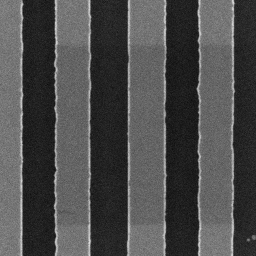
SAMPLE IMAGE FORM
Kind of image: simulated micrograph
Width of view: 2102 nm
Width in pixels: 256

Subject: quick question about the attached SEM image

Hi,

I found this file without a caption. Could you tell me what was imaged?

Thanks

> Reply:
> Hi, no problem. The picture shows lines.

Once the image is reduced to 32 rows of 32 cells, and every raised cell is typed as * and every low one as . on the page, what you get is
***....****.....*****....****...
***....****.....*****....****...
***....****.....*****....****...
***....****.....*****....****...
***....****.....*****....****...
***....****.....*****....****...
***....****.....*****....****...
***....****.....*****....****...
***....****.....*****....****...
***....****.....*****....****...
***....****.....*****....****...
***....****.....*****....****...
***....****.....*****....****...
***....****.....*****....****...
***....****.....*****....****...
***....****.....*****....****...
***....****.....*****....****...
***....****.....*****....****...
***....****.....*****....****...
***....****.....*****....****...
***....****.....*****....****...
***....****.....*****....****...
***....****.....*****....****...
***....****.....*****....****...
***....****.....*****....****...
***....****.....*****....****...
***....****.....*****....****...
***....****.....*****....****...
***....****.....*****....****...
***....****.....*****....****...
***....****.....*****....****...
***....****.....*****....****...